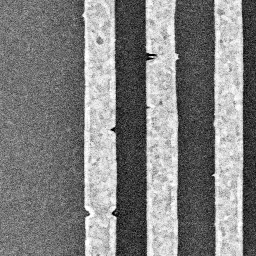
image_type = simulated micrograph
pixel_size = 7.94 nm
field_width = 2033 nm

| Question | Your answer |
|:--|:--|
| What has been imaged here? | one or a few lines or trenches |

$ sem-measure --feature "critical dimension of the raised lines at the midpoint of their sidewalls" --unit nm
210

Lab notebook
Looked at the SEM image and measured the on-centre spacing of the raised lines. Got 511 nanometers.